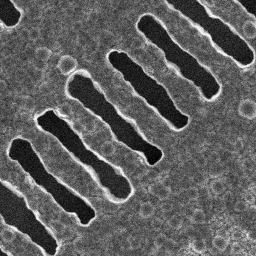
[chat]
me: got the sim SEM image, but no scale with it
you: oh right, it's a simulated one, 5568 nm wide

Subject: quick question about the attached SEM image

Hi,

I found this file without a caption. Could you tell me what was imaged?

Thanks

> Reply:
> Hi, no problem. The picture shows holes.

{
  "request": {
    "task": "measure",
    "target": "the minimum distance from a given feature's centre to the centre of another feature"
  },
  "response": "968 nm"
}